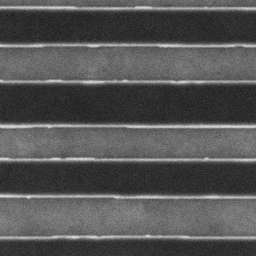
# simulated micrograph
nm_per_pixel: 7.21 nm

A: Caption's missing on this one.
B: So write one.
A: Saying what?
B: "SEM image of lines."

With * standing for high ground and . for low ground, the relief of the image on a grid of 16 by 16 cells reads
*****...**......
****************
****************
................
................
****************
****************
****************
................
................
****************
****************
................
................
................
****************